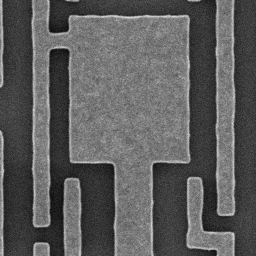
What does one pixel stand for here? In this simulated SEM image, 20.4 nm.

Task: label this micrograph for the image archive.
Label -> wiring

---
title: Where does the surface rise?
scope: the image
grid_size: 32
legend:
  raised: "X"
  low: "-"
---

----XX---------------------XX---
----XX---------------------XX---
----XX---XXXXXXXXXXXXXXX---XX---
----XX---XXXXXXXXXXXXXXX---XX---
----XXXXXXXXXXXXXXXXXXXX---XX---
----XXXXXXXXXXXXXXXXXXXX---XX---
----XX---XXXXXXXXXXXXXXX---XX---
----XX---XXXXXXXXXXXXXXX---XX---
----XX---XXXXXXXXXXXXXXX---XX---
----XX---XXXXXXXXXXXXXXX---XX---
----XX---XXXXXXXXXXXXXXX---XX---
----XX---XXXXXXXXXXXXXXX---XX---
----XX---XXXXXXXXXXXXXXX---XX---
----XX---XXXXXXXXXXXXXXX---XX---
----XX---XXXXXXXXXXXXXXX---XX---
----XX---XXXXXXXXXXXXXXX---XX---
----XX---XXXXXXXXXXXXXXX---XX---
----XX---XXXXXXXXXXXXXXX---XX---
----XX---XXXXXXXXXXXXXXX---XX---
----XX---XXXXXXXXXXXXXXX---XX---
----XX--------XXXXX--------XX---
----XX--------XXXXX--------XX---
----XX--XX----XXXXX-----X--XX---
----XX--XX----XXXXX-----X--XX---
----XX--XX----XXXXX-----X--XX---
----XX--XX----XXXXX-----X--XX---
----XX--XX-----XXXX-----X--XX---
----XX--XX----XXXXX-----X-------
--------XX----XXXXX-----X-------
--------XX----XXXXX----XXXXXX---
-----X--XX----XXXXX----XXXXXX---
----XX--XX----XXXXX--------XX---